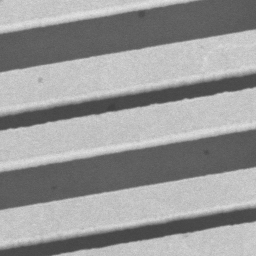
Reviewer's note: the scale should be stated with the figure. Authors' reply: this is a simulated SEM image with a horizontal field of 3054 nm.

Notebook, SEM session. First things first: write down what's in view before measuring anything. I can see lines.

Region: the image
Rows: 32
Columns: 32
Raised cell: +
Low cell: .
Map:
+++++++++++++++++++++...........
+++++++++++++++.................
+++++++++.......................
+++.............................
...........................+++++
.....................+++++++++++
...............+++++++++++++++++
.........+++++++++++++++++++++++
....++++++++++++++++++++++++++++
++++++++++++++++++++++++++++....
+++++++++++++++++++++++.........
+++++++++++++++++...........++++
+++++++++++............+++++++++
+++++............+++++++++++++++
...........+++++++++++++++++++++
......++++++++++++++++++++++++++
++++++++++++++++++++++++++++....
+++++++++++++++++++++++.........
+++++++++++++++++...............
+++++++++++.....................
+++++...........................
.............................+++
.......................+++++++++
.................+++++++++++++++
...........+++++++++++++++++++++
....++++++++++++++++++++++++++++
++++++++++++++++++++++++++++....
+++++++++++++++++++++...........
++++++++++++++++...........+++++
+++++++++............+++++++++++
+++............+++++++++++++++++
.........+++++++++++++++++++++++